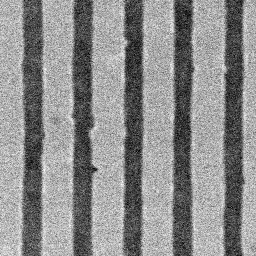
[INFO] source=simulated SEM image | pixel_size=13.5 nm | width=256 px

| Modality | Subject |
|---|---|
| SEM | parallel lines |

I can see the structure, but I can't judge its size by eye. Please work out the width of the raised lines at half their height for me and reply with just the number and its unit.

404 nm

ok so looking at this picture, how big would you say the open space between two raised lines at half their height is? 19.9 pixels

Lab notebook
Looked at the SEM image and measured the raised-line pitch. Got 679 nm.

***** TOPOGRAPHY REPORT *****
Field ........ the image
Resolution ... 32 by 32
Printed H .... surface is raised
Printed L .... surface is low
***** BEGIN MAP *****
HHHLLHHHHLLLHHHLLLHHHHLLHHHHLLLH
HHHLLHHHHLLLHHHLLLHHHHLLHHHHLLLH
HHHLLLHHHLLLHHHLLLHHHHLLHHHHLLLH
HHHLLLHHHLLLHHHLLLHHHHLLHHHHLLLH
HHHLLLHHHLLLHHHLLLHHHHLLHHHHLLLH
HHHLLLHHHLLLHHHHLLHHHHLLHHHHLLHH
HHHLLLHHHLLLHHHHLLHHHHLLHHHHLLHH
HHHLLHHHHLLLHHHHLLHHHHLLHHHHLLLH
HHHLLHHHHLLLHHHHLLHHHHLLHHHHLLLH
HHHLLHHHHLLLHHHHLLHHHHLLHHHHLLLH
HHHLLHHHHLLLHHHHLLHHHHLLHHHHLLHH
HHHLLHHHHLLLHHHLLLHHHHLLHHHHLLHH
HHHLLHHHHLLLHHHLLLHHHHLLHHHHLLHH
HHHLLHHHHLLLHHHLLLHHHHLLHHHHLLHH
HHHLLHHHHLLLHHHLLLHHHHLLHHHHLLHH
HHHLLHHHHLLLHHHLLLHHHHLLHHHHLLHH
HHHLLLHHHLLHHHHHLLHHHHLLHHHHLLHH
HHHLLHHHHLLHHHHHLLHHHHLLHHHHLLHH
HHHLLHHHHLLLHHHLLLHHHHLLHHHHLLHH
HHHLLHHHHLLLHHHLLLHHHHLLHHHHLLHH
HHHLLHHHHLLLHHHLLLHHHHLLHHHHLLHH
HHHLLHHHHLLLHHHLLLHHHHLLHHHHLLHH
HHHLLHHHHLLLHHHLLLHHHHLLHHHHLLLH
HHHLLHHHHLLLHHHLLLHHHHLLHHHHLLHH
HHHLLHHHHLLLHHHLLLHHHLLLHHHHLLHH
HHHLLHHHHLLLHHHLLLHHHLLLHHHHLLHH
HHHLLHHHHLLLHHHLLLHHHLLLHHHHLLHH
HHHLLHHHHLLLHHHLLLHHHLLLHHHHLLHH
HHHLLHHHHLLLHHHLLLHHHLLLHHHHLLHH
HHHLLHHHHLLLHHHLLLHHHLLLHHHHLLHH
HHHLLHHHHLLLHHHLLLHHHLLLHHHHLLHH
HHHLLHHHHLLLHHHLLLHHHLLLHHHHLLHH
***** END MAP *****